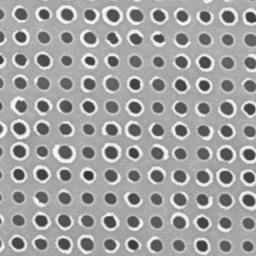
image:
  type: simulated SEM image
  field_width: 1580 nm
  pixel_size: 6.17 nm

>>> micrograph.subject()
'a regular array of holes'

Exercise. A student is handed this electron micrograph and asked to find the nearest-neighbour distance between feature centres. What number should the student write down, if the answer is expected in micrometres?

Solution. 0.14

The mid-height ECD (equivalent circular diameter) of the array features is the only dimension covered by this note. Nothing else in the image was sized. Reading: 75.3 nm